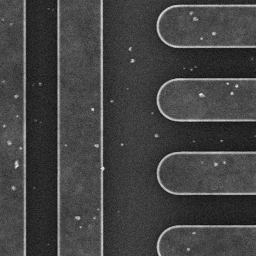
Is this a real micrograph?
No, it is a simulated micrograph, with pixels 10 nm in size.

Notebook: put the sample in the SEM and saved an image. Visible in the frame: groups of lines, slits or small figures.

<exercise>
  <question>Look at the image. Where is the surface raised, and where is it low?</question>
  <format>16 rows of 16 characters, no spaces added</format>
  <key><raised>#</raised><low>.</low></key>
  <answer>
##..##.....#####
##..##....######
##..##....######
##..##..........
##..##..........
##..##....######
##..##....######
##..##.....#####
##..##..........
##..##..........
##..##....######
##..##....######
##..##..........
##..##..........
##..##....######
##..##....######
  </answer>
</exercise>